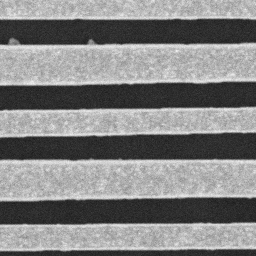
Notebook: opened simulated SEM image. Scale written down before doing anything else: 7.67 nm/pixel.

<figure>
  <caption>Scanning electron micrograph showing lines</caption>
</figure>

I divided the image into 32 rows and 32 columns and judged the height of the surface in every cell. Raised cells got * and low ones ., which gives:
********************************
********************************
................................
................................
................................
...............................*
********************************
********************************
********************************
********************************
********........................
................................
................................
..............................*.
********************************
********************************
***************************.....
................................
................................
................................
********************************
********************************
********************************
********************************
********************************
................................
................................
................................
********************************
********************************
********************************
................................